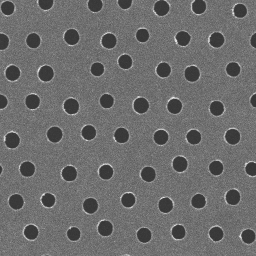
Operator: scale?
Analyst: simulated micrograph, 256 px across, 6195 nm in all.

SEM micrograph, a regular array of holes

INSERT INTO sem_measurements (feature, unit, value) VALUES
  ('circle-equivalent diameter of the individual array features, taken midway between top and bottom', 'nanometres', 358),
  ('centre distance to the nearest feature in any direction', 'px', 32.5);